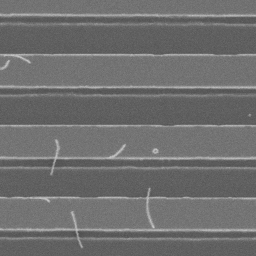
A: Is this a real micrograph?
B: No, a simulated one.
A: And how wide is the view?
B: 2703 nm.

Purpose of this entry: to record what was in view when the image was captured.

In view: lines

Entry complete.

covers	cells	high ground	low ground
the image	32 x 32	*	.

********************************
********************************
................................
................................
................................
................................
................................
********************************
********************************
********************************
********************************
................................
................................
................................
................................
................................
********************************
********************************
********************************
********************************
................................
................................
................................
................................
................................
********************************
********************************
********************************
********************************
................................
................................
................................